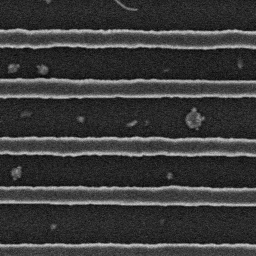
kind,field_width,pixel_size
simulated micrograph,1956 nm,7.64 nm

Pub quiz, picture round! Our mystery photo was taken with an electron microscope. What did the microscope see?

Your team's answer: lines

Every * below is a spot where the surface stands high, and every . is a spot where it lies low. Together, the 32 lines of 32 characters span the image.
................................
................................
................................
................................
********************************
********************************
................................
................................
................................
................................
********************************
********************************
................................
................................
................................
................................
................................
*******************************.
********************************
.........*.......*.....**...**.*
................................
................................
................................
***************************.....
********************************
........*......*****************
................................
................................
................................
................................
.............*..................
********************************